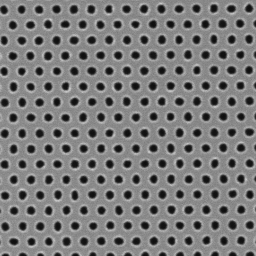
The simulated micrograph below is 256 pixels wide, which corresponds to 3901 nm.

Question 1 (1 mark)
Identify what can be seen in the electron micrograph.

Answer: a regular array of holes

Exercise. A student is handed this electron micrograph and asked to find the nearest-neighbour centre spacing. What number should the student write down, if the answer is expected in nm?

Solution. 263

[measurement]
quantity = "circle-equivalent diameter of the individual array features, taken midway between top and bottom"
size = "136 nm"